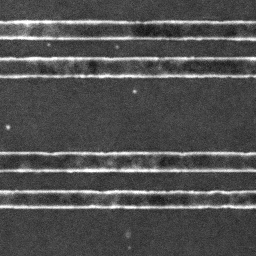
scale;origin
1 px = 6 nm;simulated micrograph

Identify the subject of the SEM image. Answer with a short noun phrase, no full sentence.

lines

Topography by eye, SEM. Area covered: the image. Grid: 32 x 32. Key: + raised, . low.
................................
................................
................................
++++++++++++++++++++++++++++++++
++++++++++++++++++++++++++++++++
................................
................................
++++++++++++++++++++++++++++++++
++++++++++++++++++++++++++++++++
++++++++++++++++++++++++++++++++
................................
................................
................................
................................
................................
................................
................................
................................
................................
++++++++++++++++++++++++++++++++
++++++++++++++++++++++++++++++++
................................
................................
................................
++++++++++++++++++++++++++++++++
++++++++++++++++++++++++++++++++
................................
................................
................................
................................
................................
................................